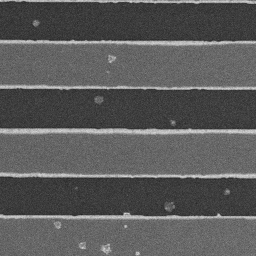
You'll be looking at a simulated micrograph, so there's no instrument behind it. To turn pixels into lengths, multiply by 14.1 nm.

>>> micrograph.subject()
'lines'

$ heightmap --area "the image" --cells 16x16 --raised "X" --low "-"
----------------
----------------
----------------
XXXXXXXXXXXXXXXX
XXXXXXXXXXXXXXXX
---XXXXXXXXXXXXX
----------------
----------------
XXXXXXXXXXXXXXXX
XXXXXXXXXXXXXXXX
XXXXXXXXXXXXXXXX
----------------
----------------
XXXX------------
XXXXXXXXXXXXXXXX
XXXXXXXXXXXXXXXX